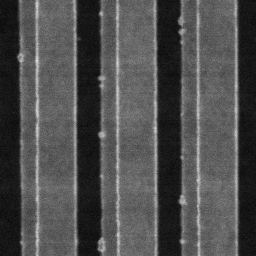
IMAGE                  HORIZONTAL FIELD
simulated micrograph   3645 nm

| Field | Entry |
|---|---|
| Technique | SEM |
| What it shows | lines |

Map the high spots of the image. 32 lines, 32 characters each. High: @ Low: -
--@@@@@@@----@@@@@@----@@@@@@@--
---@@@@@@----@@@@@@----@@@@@@@--
---@@@@@@----@@@@@@---@@@@@@@---
---@@@@@@----@@@@@@----@@@@@@@--
---@@@@@@----@@@@@@----@@@@@@@--
---@@@@@@----@@@@@@@---@@@@@@@--
--@@@@@@@----@@@@@@@---@@@@@@@--
--@@@@@@@----@@@@@@@---@@@@@@@--
---@@@@@@----@@@@@@@---@@@@@@@--
---@@@@@@----@@@@@@@---@@@@@@@--
---@@@@@@----@@@@@@@---@@@@@@@--
---@@@@@@----@@@@@@@---@@@@@@@--
---@@@@@@----@@@@@@@---@@@@@@@--
---@@@@@@----@@@@@@@---@@@@@@@--
---@@@@@@----@@@@@@@---@@@@@@@--
---@@@@@@----@@@@@@@---@@@@@@@--
---@@@@@@----@@@@@@@---@@@@@@@--
---@@@@@@----@@@@@@@---@@@@@@@--
---@@@@@@----@@@@@@@---@@@@@@@--
---@@@@@@----@@@@@@@---@@@@@@@--
---@@@@@@----@@@@@@@---@@@@@@@--
---@@@@@@----@@@@@@@---@@@@@@@--
---@@@@@@----@@@@@@@---@@@@@@@--
---@@@@@@----@@@@@@@---@@@@@@@--
---@@@@@@----@@@@@@@---@@@@@@@--
---@@@@@@----@@@@@@@---@@@@@@@--
---@@@@@@----@@@@@@@---@@@@@@@--
---@@@@@@----@@@@@@@---@@@@@@@--
---@@@@@@----@@@@@@@---@@@@@@@--
---@@@@@@----@@@@@@@---@@@@@@@--
---@@@@@@@--@@@@@@@@---@@@@@@@--
---@@@@@@----@@@@@@@---@@@@@@@--